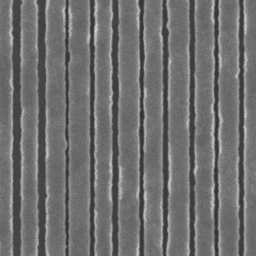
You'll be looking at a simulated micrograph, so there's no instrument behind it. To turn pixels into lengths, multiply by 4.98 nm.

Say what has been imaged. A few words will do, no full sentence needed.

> parallel lines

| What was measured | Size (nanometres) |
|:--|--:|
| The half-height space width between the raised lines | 29.9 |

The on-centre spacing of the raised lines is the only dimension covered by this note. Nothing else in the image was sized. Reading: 24.9 px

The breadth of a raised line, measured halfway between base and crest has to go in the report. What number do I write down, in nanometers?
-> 94.7